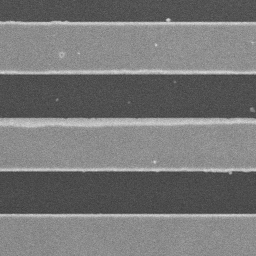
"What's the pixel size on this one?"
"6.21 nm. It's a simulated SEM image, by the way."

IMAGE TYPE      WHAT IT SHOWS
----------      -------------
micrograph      lines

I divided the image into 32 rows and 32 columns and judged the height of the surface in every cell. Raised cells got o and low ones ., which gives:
................................
................................
................................
oooooooooooooooooooooooooooooooo
oooooooooooooooooooooooooooooooo
oooooooooooooooooooooooooooooooo
oooooooooooooooooooooooooooooooo
oooooooooooooooooooooooooooooooo
oooooooooooooooooooooooooooooooo
................................
................................
................................
................................
................................
................................
oooooooooooooooooooooooooooooooo
oooooooooooooooooooooooooooooooo
oooooooooooooooooooooooooooooooo
oooooooooooooooooooooooooooooooo
oooooooooooooooooooooooooooooooo
oooooooooooooooooooooooooooooooo
................................
................................
................................
................................
................................
................................
oooooooooooooooooooooooooooooooo
oooooooooooooooooooooooooooooooo
oooooooooooooooooooooooooooooooo
oooooooooooooooooooooooooooooooo
oooooooooooooooooooooooooooooooo